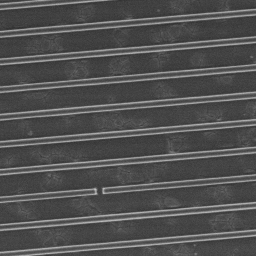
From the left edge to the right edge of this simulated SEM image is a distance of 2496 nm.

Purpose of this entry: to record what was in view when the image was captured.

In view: parallel lines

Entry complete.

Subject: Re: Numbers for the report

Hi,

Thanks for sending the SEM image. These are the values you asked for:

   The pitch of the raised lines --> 268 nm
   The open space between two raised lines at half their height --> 0.21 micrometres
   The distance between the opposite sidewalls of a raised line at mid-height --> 54.6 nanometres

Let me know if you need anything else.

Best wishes